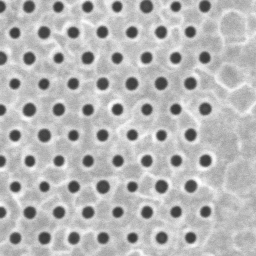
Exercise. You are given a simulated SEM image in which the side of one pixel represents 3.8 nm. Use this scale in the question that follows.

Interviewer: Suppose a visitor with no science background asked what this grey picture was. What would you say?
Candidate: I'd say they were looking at a regular array of holes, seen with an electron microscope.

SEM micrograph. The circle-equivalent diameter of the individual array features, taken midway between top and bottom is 0.0459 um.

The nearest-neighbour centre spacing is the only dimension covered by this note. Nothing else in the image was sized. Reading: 0.111 µm